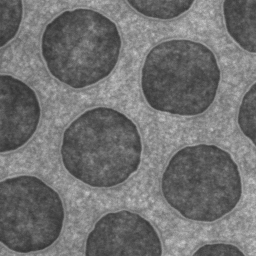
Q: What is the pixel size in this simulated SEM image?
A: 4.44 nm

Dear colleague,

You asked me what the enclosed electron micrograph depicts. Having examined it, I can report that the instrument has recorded holes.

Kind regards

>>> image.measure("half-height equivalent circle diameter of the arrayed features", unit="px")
79.1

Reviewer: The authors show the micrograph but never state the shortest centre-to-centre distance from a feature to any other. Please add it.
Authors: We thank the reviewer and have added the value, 459 nm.